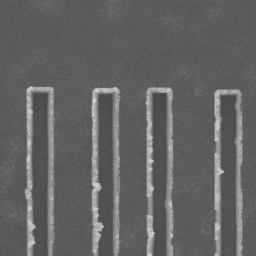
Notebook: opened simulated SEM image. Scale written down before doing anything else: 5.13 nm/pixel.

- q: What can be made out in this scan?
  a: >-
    parallel lines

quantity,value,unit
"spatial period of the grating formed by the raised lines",0.309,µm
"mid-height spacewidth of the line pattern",89.8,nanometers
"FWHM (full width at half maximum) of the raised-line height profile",246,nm